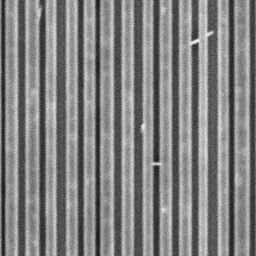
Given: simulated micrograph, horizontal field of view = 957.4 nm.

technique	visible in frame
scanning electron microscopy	parallel lines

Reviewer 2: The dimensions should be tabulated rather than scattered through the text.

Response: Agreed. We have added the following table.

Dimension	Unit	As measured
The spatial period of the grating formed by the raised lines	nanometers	71.9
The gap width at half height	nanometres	29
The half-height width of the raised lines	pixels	11.6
